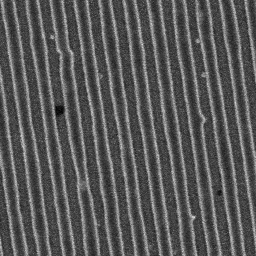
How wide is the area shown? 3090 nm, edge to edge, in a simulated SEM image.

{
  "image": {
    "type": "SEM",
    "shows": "parallel lines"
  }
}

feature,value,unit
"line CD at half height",143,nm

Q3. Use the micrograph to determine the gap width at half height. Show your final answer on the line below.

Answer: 142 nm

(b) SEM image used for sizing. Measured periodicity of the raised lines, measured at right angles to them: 290 nanometres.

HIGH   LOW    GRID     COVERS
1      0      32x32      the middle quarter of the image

11000111000111000111000111000111
11000111000111000111000111000111
11000111000111000111000011000011
11000111000011000011100011100011
11100011100011100011100011100011
11100011100011100011100011100011
11100011100011100011100011100011
11100011100011100011100011100011
11100011100011100011100011100011
11100011100011100011100001100001
11100001100001110001110011110001
01110001110001110001110001110001
01110001110001110001110001110001
01110001110001110001110001110001
01110001110001110001110001110001
01110001110000110001110001110000
01110001110000110001110001111000
01111000110000110000111000111000
01111000111000111000111000111000
00111000111000111000111000111000
00111000111000111000111000111000
00111000111000111000111000011000
00111000111000011000111000011000
00011000111000011000111000011100
00011000111100011000011100011100
00011000011100011100011100011100
00011100011100011100011100011100
00011100011100011100011100011100
00011100011100011100011100001100
00001100011100001100011100001100
00001100011110001100011100001100
00001100011110001100001110001110